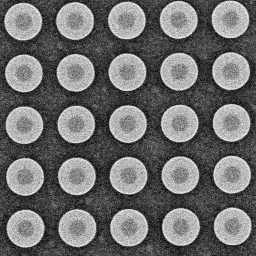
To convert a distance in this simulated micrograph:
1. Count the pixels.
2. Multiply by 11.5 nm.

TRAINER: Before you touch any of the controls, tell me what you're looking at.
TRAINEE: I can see an array of small figures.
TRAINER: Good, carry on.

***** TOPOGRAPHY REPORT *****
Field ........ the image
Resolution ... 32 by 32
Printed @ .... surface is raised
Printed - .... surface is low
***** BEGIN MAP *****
--@@-----@-----@@----@@-----@@--
-@@@@--@@@@---@@@@--@@@@---@@@@-
-@@@@--@@@@@--@@@@--@@@@@--@@@@-
-@@@@--@@@@@--@@@@--@@@@---@@@@-
-@@@----@@@----@@----@@-----@@--
--------------------------------
--------------------------------
-@@@@---@@@---@@@@---@@@---@@@@-
-@@@@--@@@@@--@@@@--@@@@@--@@@@-
-@@@@--@@@@@--@@@@--@@@@@--@@@@-
-@@@@---@@@---@@@@---@@@---@@@@-
--------------------------------
--------------------------------
--@@-----@@----@@----@@@----@@--
-@@@@--@@@@@--@@@@--@@@@@--@@@@-
-@@@@--@@@@@--@@@@--@@@@@--@@@@-
-@@@@--@@@@@--@@@@--@@@@@--@@@@-
--@@----@@@----@@----@@@----@@--
--------------------------------
--------------------------------
--@@@---@@@---@@@@---@@@---@@@@-
-@@@@--@@@@@--@@@@--@@@@@--@@@@-
-@@@@--@@@@@--@@@@--@@@@@--@@@@-
-@@@@---@@@---@@@@---@@@---@@@@-
--------------------------------
--------------------------------
--@@-----@@----@@----@@@----@@--
-@@@@---@@@@--@@@@--@@@@@--@@@@-
-@@@@--@@@@@--@@@@--@@@@@--@@@@-
-@@@@---@@@@--@@@@---@@@@--@@@@-
--@@-----@@----@@-----@-----@@--
--------------------------------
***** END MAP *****